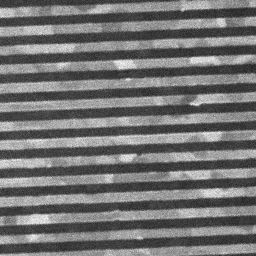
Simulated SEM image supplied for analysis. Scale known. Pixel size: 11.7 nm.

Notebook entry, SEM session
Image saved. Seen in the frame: parallel lines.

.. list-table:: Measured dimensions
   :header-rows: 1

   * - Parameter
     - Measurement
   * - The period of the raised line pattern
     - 220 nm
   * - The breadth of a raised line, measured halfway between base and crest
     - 93.2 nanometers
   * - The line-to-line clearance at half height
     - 124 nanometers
